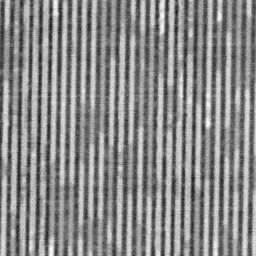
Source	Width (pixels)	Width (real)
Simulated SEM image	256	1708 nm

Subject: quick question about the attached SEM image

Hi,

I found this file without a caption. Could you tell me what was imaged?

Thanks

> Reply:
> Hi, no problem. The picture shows parallel lines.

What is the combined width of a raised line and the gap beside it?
0.0644 microns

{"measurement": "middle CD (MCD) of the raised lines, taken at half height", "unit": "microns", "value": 0.0258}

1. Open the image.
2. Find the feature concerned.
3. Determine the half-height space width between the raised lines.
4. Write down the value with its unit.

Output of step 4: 38.3 nm